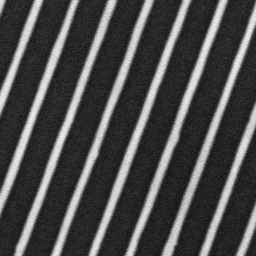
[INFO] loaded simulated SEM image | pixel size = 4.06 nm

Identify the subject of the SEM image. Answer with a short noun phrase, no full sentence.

parallel lines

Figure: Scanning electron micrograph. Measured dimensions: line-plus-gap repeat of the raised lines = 141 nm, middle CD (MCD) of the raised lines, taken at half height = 29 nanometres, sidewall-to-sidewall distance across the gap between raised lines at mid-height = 113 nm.